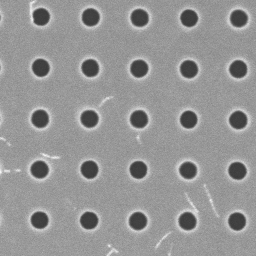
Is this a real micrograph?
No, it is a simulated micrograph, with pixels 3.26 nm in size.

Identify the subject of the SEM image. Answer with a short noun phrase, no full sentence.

a regular array of holes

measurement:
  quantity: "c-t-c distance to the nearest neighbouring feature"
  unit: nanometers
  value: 161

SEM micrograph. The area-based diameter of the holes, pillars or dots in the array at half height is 59.3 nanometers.